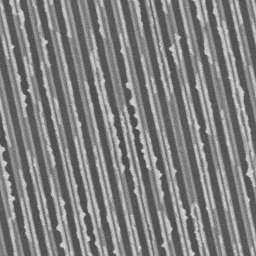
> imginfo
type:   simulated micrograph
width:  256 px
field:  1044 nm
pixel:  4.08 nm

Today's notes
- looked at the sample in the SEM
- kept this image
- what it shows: parallel lines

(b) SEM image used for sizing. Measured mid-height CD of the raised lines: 32.4 nm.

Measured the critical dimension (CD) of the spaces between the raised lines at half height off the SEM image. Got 0.0359 microns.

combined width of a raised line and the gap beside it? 67.2 nanometers